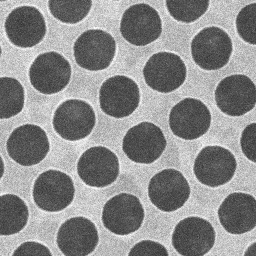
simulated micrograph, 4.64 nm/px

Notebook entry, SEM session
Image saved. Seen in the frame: a regular array of holes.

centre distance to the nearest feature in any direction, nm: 239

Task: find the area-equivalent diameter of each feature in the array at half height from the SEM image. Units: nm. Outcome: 198